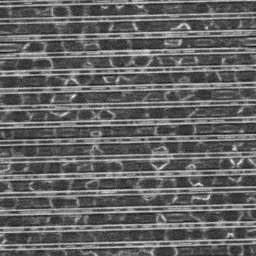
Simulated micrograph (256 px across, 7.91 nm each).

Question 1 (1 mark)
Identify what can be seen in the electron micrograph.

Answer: parallel lines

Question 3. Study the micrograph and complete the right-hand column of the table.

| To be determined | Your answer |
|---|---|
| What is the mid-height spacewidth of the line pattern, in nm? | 101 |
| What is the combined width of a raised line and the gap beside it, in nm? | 138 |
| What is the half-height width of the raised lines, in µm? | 0.0405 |